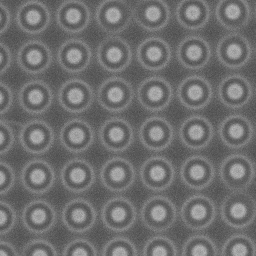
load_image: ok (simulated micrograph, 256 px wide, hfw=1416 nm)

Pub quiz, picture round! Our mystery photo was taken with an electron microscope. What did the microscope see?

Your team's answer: an array of small figures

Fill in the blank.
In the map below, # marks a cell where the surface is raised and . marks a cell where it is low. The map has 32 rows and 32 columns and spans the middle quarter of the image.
.....#####.....######...#######.
##.#############################
################################
################################
##..#######....######....#####..
......####......####......###...
......###.......###.......###...
.......##........##........##...
.......##........##.......###...
......###.......####......####..
......####.....######....######.
##..############################
################################
################################
##..#######....######....######.
#.....####......####......####..
......####......####.......###..
.......##........##........##...
.......###.......###......####..
......####......####......####..
#.....#####....######....#######
##.#############################
################################
################################
###.########...######.....#####.
#.....#####.....####.......###..
.......###.......###.......###..
.......###.......###.......###..
.......###.......###.......###..
.......###.......###......#####.
#.....#####.....#####....#######
###.############################